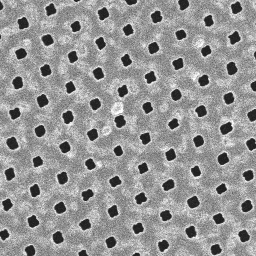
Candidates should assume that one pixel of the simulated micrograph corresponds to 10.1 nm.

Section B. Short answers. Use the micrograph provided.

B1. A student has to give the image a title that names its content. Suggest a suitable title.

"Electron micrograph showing a regular array of holes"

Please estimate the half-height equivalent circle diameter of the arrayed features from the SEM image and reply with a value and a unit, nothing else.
111 nanometers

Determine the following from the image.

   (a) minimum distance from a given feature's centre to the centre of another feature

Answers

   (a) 0.303 um